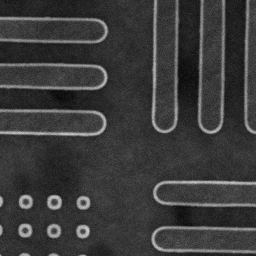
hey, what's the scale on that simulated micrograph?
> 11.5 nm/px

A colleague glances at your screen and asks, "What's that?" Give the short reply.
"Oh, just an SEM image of groups of lines, slits or small figures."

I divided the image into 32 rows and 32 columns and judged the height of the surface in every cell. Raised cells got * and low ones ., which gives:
...................***...***...*
...................***...***...*
************.......***...***...*
*************......***...***...*
*************......***...***...*
...................***...***...*
...................***...***...*
...................***...***...*
*************......***...***...*
*************......***...***...*
*************......***...***...*
...................***...***...*
...................***...***...*
...................***...***...*
*************......***...***...*
*************......***...***...*
*************...................
................................
................................
................................
................................
................................
................................
....................************
...................*************
...*..*...*............*********
................................
................................
...*..*...*.....................
...................*************
...................*************
...............................*